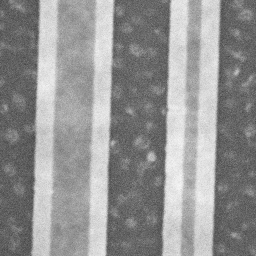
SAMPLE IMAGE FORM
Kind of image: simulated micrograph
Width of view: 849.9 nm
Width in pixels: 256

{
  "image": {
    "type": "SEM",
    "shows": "one or a few lines or trenches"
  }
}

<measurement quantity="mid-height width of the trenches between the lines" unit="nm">236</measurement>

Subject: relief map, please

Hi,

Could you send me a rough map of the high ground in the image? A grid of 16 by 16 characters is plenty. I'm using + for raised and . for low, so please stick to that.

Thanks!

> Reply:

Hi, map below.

...++++....++...
...++++....++...
...++++....++...
...++++....++...
...++++....++...
...+++.....++...
...+++.....++...
...+++.....++...
...+++.....++...
...+++.....++...
...+++.....++...
...+++.....++...
...+++.....++...
...+++.....++...
..++++.....++...
..++++.....++...